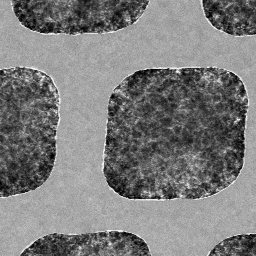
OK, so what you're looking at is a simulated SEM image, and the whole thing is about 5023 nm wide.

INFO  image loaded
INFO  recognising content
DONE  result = holes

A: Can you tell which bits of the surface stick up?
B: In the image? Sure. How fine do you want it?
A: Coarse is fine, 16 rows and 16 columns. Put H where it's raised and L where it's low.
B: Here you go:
HLLLLLLLLHHHHLLL
HLLLLLLLHHHHHLLL
HHHHHHHHHHHHHHHH
HHHHHHHHHHHHHHHH
LLLHHHHHHLLLLLHH
LLLLHHHHHLLLLLLH
LLLLHHHLLLLLLLLL
LLLLHHHLLLLLLLLH
LLLHHHHLLLLLLLLH
LLLHHHLLLLLLLLLH
LLLHHHLLLLLLLLLH
LLLHHHHLLLLLLLHH
HHHHHHHHHHHHHHHH
HHHHHHHHHHHHHHHH
HHHHHHLLHHHHHHHH
HHLLLLLLLHHHHLLL